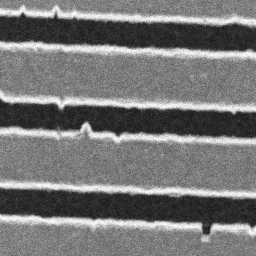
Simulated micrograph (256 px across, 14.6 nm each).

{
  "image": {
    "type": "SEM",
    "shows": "one or a few lines or trenches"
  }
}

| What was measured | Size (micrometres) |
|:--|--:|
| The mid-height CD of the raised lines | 0.768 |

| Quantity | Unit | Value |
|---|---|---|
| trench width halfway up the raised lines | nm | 489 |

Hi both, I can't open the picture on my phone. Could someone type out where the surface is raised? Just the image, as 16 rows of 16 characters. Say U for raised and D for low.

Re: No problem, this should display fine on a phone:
UUUUUUUUUUUUUUUU
DDDDDDDDDDDDDDDD
DDDDDDDDDDDDDDDD
UUUUUUUUUUUUUUUU
UUUUUUUUUUUUUUUU
UUUUUUUUUUUUUUUU
DDDDDDDUUUUUUUUU
DDDDDDDDDDDDDDDD
UUUUUUUDDDDDDDDD
UUUUUUUUUUUUUUUU
UUUUUUUUUUUUUUUU
UUUUUUUUUUUUUUUU
DDDDDDDDDDDDDDDD
DDDDDDDDDDDDDDDD
UUUUUUUUUUUUUUUU
UUUUUUUUUUUUUUUU